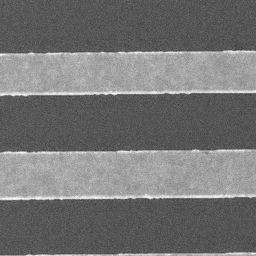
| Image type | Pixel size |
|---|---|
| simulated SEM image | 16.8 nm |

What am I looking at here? lines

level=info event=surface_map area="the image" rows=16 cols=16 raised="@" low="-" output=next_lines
----------------
----------------
----------------
@@@@@@@@@@@@@@@@
@@@@@@@@@@@@@@@@
@@@@@@@@@@@@@@@@
----------------
----------------
----------------
-------@@@@@@@@@
@@@@@@@@@@@@@@@@
@@@@@@@@@@@@@@@@
----------------
----------------
----------------
----------------